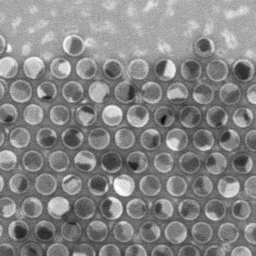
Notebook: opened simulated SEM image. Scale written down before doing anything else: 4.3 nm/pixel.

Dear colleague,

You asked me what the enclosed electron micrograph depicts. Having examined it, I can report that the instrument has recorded a regular array of raised bodies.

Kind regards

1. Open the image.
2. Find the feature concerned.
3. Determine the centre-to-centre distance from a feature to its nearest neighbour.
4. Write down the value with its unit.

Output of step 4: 0.112 um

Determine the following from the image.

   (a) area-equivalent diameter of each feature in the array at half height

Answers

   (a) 88 nanometers